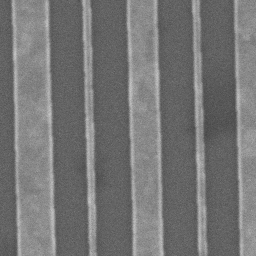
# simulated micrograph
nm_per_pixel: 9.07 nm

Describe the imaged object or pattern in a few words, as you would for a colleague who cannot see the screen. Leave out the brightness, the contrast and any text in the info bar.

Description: lines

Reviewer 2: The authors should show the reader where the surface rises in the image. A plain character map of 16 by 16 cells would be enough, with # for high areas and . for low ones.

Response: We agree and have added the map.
.##.....##.....#
.##.....##.....#
.##.....##.....#
.##.....##.....#
.##.....##.....#
.##.....##.....#
.##.....##.....#
.##.....##.....#
.##.....##.....#
.##.....##.....#
.##.....##.....#
.##.....##.....#
.##.....##.....#
.##.....##.....#
.##.....##.....#
.##.....##.....#